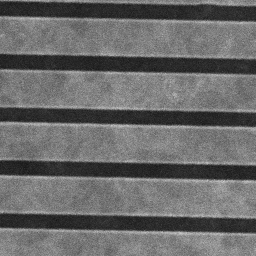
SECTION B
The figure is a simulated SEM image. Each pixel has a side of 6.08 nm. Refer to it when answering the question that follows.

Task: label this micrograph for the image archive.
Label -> parallel lines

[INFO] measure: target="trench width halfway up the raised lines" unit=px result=16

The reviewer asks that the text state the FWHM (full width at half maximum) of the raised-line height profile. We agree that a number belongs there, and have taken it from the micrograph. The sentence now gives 36.9 px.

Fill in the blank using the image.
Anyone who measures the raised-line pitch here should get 323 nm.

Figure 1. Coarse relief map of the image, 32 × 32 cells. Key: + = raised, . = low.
........................+..+++++
................................
++++++++++++++..................
++++++++++++++++++++++++++++++++
++++++++++++++++++++++++++++++++
++++++++++++++++++++++++++++++++
++++++++++++++++++++++++++++++++
................................
................................
++++++++++++++++++++++++++++++++
++++++++++++++++++++++++++++++++
++++++++++++++++++++++++++++++++
++++++++++++++++++++++++++++++++
........++++++++++++++++++++++++
................................
++++............................
++++++++++++++++++++++++++++++++
++++++++++++++++++++++++++++++++
++++++++++++++++++++++++++++++++
++++++++++++++++++++++++++++++++
...........................+++++
................................
++++++++++++++++++++++..........
++++++++++++++++++++++++++++++++
++++++++++++++++++++++++++++++++
++++++++++++++++++++++++++++++++
++++++++++++++++++++++++++++++++
................................
................................
++++++++++++++++++++++++++++++++
++++++++++++++++++++++++++++++++
++++++++++++++++++++++++++++++++